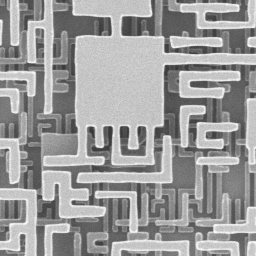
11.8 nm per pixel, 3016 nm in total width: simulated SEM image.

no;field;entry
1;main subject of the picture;wiring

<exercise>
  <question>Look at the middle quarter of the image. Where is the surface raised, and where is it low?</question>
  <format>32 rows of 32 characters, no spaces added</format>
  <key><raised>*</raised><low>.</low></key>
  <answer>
...**********************.......
...**********************.......
...**********************....***
...**********************....***
...**********************....**.
...**********************....**.
...**********************....***
...**********************....***
...**********************.......
...**********************.......
...**********************.....**
...**********************....***
...**********************....***
...**********************....**.
...**********************....**.
...***.***..**..***.***......**.
....**..**..**..**...**......**.
....**..**..**..**...*.......**.
....**..**..**..**...*...**..**.
....**..**..**..***..*...**..**.
....**..**..**..***..*...**...*.
....**......**.......*...**.....
...***......**.......*...**.....
**********..**********...**.....
**********..***********.***.....
........................***.....
........................***.....
**..***********************.....
**.************************.....
**..*****..*****.**********.....
**..............................
******..........................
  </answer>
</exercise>